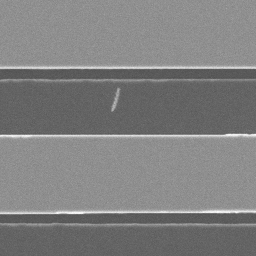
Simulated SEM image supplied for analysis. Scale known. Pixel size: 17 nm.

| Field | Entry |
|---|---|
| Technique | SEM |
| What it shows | lines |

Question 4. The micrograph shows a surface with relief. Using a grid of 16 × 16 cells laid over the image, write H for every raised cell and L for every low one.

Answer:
HHHHHHHHHHHHHHHH
HHHHHHHHHHHHHHHH
HHHHHHHHHHHHHHHH
HHHHHHHHHHHHHHHH
LLLLLLLLLLLLLLLL
LLLLLLLLLLLLLLLL
LLLLLLLLLLLLLLLL
LLLLLLLLLLLLLLLL
HHHHHHHHHHHHHHHH
HHHHHHHHHHHHHHHH
HHHHHHHHHHHHHHHH
HHHHHHHHHHHHHHHH
HHHHHHHHHHHHHHHH
LLLLLLLLLLLLLLLL
LLLLLLLLLLLLLLLL
LLLLLLLLLLLLLLLL